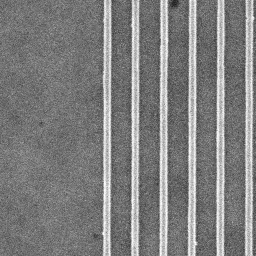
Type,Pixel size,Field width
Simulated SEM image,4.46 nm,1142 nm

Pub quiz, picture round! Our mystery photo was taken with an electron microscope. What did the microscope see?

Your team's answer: parallel lines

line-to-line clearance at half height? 98.1 nm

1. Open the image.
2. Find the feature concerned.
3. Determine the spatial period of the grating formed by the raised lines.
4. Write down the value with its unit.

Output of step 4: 0.127 microns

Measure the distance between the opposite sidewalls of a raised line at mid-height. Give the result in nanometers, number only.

26.8